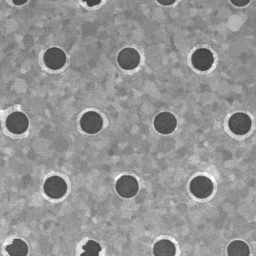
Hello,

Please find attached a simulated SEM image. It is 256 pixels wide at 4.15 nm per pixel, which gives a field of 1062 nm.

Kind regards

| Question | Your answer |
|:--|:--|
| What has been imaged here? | a regular array of holes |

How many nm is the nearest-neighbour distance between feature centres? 305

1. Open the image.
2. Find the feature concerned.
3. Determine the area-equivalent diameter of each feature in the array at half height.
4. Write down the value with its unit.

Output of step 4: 99.2 nm